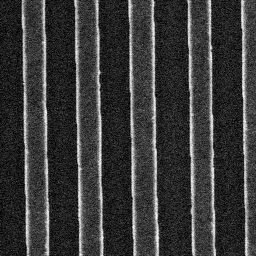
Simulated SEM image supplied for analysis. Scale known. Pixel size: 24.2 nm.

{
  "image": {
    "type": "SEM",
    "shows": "lines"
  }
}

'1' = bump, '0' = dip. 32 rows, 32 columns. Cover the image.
00011100011100001110000011000011
00011100011100001110000011000011
00011100011100001110000011000011
00011100011100001110000011000011
00011100011100001110000011000011
00011100011100001110000011000011
00011100011100001110000011000011
00011100001100001110000011000011
00011100001100001110000011000011
00011100001100001110000011000011
00011100001100001110000011000011
00011100001100001110000011000011
00011100001100001110000011000011
00011100001100001110000011000011
00011100001100001110000011100011
00011100001110001110000011100011
00011100001110000110000011100011
00011100001110000110000011100011
00011100001110000110000011100001
00011100001110000110000011100001
00011100001110000110000011100001
00011100001110000110000011100001
00011100001110000110000011100001
00011100001110000110000011100001
00011100001110000110000011100001
00011100001110000110000011100001
00011100001110000111000011100001
00011100001110000111000011100001
00011100001110000111000011100001
00011100001110000111000011100001
00011100001110000111000011100001
00011100001110000111000011100001